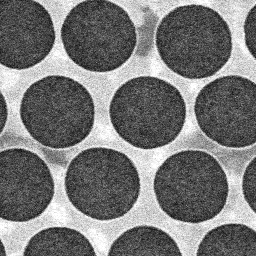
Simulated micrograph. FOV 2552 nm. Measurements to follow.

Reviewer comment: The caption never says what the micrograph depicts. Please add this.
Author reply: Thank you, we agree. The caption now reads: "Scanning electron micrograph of holes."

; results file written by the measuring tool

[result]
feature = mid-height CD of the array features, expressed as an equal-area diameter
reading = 748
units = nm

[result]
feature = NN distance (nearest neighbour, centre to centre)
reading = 842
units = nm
